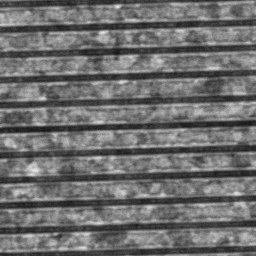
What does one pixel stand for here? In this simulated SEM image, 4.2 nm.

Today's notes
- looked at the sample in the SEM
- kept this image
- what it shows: parallel lines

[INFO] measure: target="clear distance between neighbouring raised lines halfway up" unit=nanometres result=30.4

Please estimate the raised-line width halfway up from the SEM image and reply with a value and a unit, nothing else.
75.5 nanometers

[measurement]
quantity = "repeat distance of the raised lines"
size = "106 nm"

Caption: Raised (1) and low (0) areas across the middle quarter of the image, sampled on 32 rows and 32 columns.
11111111111111111111111111111111
11111111111111111111111111111111
00000000000000000000000000000000
00000000000000000000000000000000
00000000111111111111111111111111
11111111111111111111111111111111
11111111111111111111111111111111
11111111111111111111111111111111
11111111110000000000000000000000
00000000000000000000000000000000
00000000000000000001111111111111
11111111111111111111111111111111
11111111111111111111111111111111
11111111111111111111111111111111
11111111111111111111000000000000
00000000000000000000000000000000
00000000000000000000001111111111
11111111111111111111111111111111
11111111111111111111111111111111
11111111111111111111111111111111
11111111111111111111111111111110
00000000000000000000000000000000
00000000000000000000000000000000
11111111111111111111111111111111
11111111111111111111111111111111
11111111111111111111111111111111
11111111111111111111111111111111
11111111000000000000000000000000
00000000000000000000000000000000
00000000011111111111111111111111
11111111111111111111111111111111
11111111111111111111111111111111